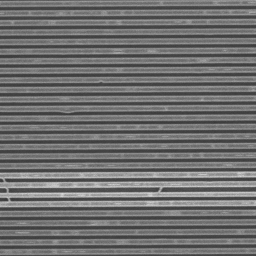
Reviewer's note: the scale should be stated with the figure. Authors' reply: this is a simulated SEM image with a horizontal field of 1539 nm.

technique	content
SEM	parallel lines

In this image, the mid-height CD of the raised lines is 0.0361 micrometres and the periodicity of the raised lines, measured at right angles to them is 57.4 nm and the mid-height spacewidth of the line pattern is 21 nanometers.